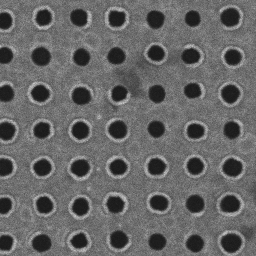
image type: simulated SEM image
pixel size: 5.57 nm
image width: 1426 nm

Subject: a regular array of holes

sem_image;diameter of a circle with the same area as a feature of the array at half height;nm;91.2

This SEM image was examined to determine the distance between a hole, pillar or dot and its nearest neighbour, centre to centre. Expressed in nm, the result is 200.